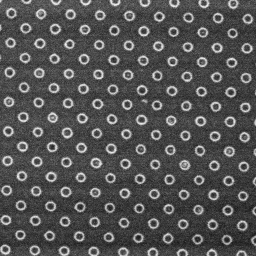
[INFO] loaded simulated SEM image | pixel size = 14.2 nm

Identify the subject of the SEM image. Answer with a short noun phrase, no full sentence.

a regular array of raised bodies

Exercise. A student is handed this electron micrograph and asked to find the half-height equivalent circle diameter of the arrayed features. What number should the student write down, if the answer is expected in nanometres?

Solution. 125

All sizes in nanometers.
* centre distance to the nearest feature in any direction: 294